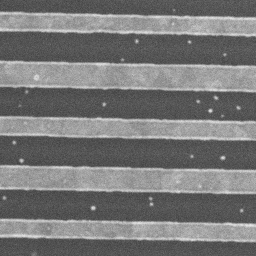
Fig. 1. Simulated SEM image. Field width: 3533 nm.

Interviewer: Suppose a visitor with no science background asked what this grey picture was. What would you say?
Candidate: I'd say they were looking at lines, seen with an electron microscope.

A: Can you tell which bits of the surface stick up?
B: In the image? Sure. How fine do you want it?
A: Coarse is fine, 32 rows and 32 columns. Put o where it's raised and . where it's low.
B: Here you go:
................................
................................
oooooooooooooooooooooooooooooooo
oooooooooooooooooooooooooooooooo
................................
................................
................................
................................
oooooooooooooooooooooooooooooooo
oooooooooooooooooooooooooooooooo
oooooooooooooooooooooooooooooooo
................................
................................
................................
................................
oooooooooooooooooooooooooooooooo
oooooooooooooooooooooooooooooooo
................................
................................
................................
................................
oooooooooooooooooooooooooooooooo
oooooooooooooooooooooooooooooooo
oooooooooooooooooooooooooooooooo
................................
................................
................................
oo..............................
oooooooooooooooooooooooooooooooo
...ooooooooooooooooooooooooooooo
................................
................................